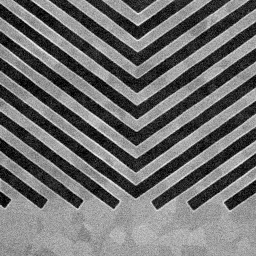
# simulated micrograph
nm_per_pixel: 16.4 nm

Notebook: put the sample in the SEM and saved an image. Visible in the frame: groups of lines, slits or small figures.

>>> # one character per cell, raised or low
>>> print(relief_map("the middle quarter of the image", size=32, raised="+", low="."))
.....++++.....++++.++++.....++++
+.....++++.....++++++.....+++++.
+++.....++++.....+++.....++++...
++++.....++++...........++++....
.+++++....++++........+++++.....
...++++.....++++.....++++.....++
....++++.....++++...++++.....+++
+....++++.....++++++++.....+++++
++.....++++.....+++++.....++++..
+++.....++++.....++.....+++++...
.+++.....++++..........++++.....
..++++.....++++.......++++.....+
...++++.....++++....+++++.....++
.....+++.....+++++.++++.....++++
+.....++++.....+++++++.....++++.
++.....++++.....++++......+++...
+++.....++++......+.....++++....
.++++.....++++.........++++.....
..++++.....++++......++++.....++
....++++.....+++....++++.....+++
.....++++.....+++++++++....+++++
+.....++++.....++++++.....++++..
+++.....++++.....+++.....++++...
++++.....++++..........++++.....
.++++.....++++........++++.....+
...++++.....+++......++++.....++
....++++.....++++..++++.....++++
.....++++.....++++++++.....++++.
++.....++++.....++++......++++..
+++.....++++.....++.....++++....
++++.....++++..........++++.....
.+++++.....++++......+++++.....+